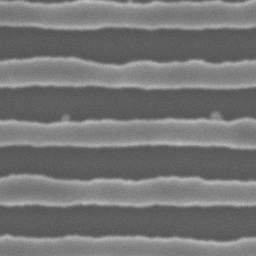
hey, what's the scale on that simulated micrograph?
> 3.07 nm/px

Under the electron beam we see lines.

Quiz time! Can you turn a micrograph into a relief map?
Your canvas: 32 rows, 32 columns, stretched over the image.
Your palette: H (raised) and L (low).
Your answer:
HHHHHHHHHHHHHHHHHHHHHHHHHHHHHHHH
HHHHHHHHHHHHHHHHHHHHHHHHHHHHHHHH
HHHHHHHHHHHHHHHHHHHHHHHHHHHHHHHH
LLLLLLHHHHHHLLLLLLHHLLHHHHLLLLLL
LLLLLLLLLLLLLLLLLLLLLLLLLLLLLLLL
LLLLLLLLLLLLLLLLLLLLLLLLLLLLLLLL
LLLLLLLLLLLLLLLLLLLLLLLLLLLLLLLL
LHHHHHHHHHLLLLLLLLLLLLLLLLLLLLLL
HHHHHHHHHHHHHHHHHHHHHHHHHHHHHHHH
HHHHHHHHHHHHHHHHHHHHHHHHHHHHHHHH
HHHHHHHHHHHHHHHHHHHHHHHHHHHHHHHH
LLLLLLLLLLLLLLLLLLLLLLLLLLLLLLLL
LLLLLLLLLLLLLLLLLLLLLLLLLLLLLLLL
LLLLLLLLLLLLLLLLLLLLLLLLLLLLLLLL
LLLLLLLLLLLLLLLLLLLLLLLLLLLLLLLL
HHHHHLHHHHHHHHHHHHHHHHHHHHHHHHHH
HHHHHHHHHHHHHHHHHHHHHHHHHHHHHHHH
HHHHHHHHHHHHHHHHHHHHHHHHHHHHHHHH
LLLLLLLLLLLLLLLLLLLLLLLLLLLLLLHH
LLLLLLLLLLLLLLLLLLLLLLLLLLLLLLLL
LLLLLLLLLLLLLLLLLLLLLLLLLLLLLLLL
LLLLLLLLLLLLLLLLLLLLLLLLLLLLLLLL
HHHHHHHHLLLLHHHLLLHHHHHHHHLLLLLL
HHHHHHHHHHHHHHHHHHHHHHHHHHHHHHHH
HHHHHHHHHHHHHHHHHHHHHHHHHHHHHHHH
HHHHLHHHHHHLHHHHHHHHHHHHHHHHHHHH
LLLLLLLLLLLLLLLLLLLLLLLLLLLLLLLL
LLLLLLLLLLLLLLLLLLLLLLLLLLLLLLLL
LLLLLLLLLLLLLLLLLLLLLLLLLLLLLLLL
HLLLLLLLLHLLLLLLLLLLLLLLLLLLLLLL
HHHHHHHHHHHHHHHHHHHHHHHHHHHHHHHH
HHHHHHHHHHHHHHHHHHHHHHHHHHHHHHHH